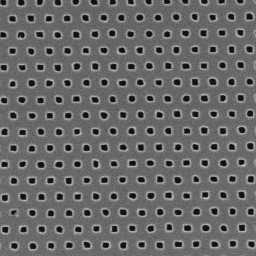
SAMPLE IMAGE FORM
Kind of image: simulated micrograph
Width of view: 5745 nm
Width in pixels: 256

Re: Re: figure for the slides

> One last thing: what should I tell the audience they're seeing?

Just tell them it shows a regular array of holes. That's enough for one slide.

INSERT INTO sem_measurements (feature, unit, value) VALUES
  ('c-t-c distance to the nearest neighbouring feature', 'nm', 403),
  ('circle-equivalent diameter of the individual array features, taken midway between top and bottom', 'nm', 150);